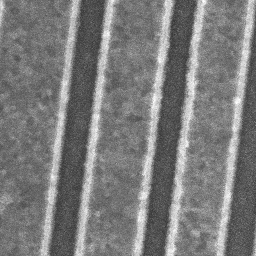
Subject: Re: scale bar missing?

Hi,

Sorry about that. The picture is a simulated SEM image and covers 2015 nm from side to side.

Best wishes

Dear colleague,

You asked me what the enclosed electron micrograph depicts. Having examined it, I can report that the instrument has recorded one or a few lines or trenches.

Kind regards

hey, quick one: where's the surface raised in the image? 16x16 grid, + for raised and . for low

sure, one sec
+++++..++++..+++
+++++..+++..++++
++++...+++..+++.
++++..++++..+++.
++++..++++..+++.
++++..++++..+++.
++++..++++..+++.
++++..++++..+++.
++++..++++..+++.
++++..+++..++++.
+++...+++..+++..
+++..++++..+++..
+++..++++..+++..
+++..++++..+++..
+++..++++..+++..
+++..++++..+++..